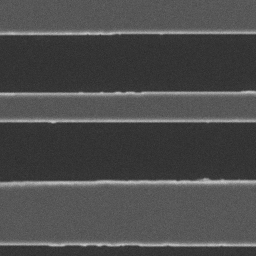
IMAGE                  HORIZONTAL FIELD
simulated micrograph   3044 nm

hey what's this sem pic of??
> lines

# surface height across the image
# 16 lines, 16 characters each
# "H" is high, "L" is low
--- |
HHHHHHHHHHHHHHHH
HHHHHHHHHHHHHHHH
LLLLLLLLLLLLLLLL
LLLLLLLLLLLLLLLL
LLLLLLLLLLLLLLLL
LLLLLLLLLLLLLLLL
HHHHHHHHHHHHHHHH
HHHHHHHHHHHHHHHH
LLLLLLLLLLLLLLLL
LLLLLLLLLLLLLLLL
LLLLLLLLLLLLLLLL
HHHHHHHHHHHHHHHH
HHHHHHHHHHHHHHHH
HHHHHHHHHHHHHHHH
HHHHHHHHHHHHHHHH
LLLLLLLLLLLLLLLL